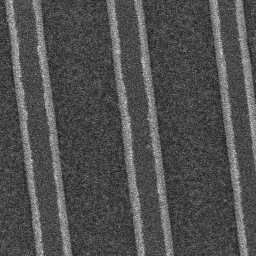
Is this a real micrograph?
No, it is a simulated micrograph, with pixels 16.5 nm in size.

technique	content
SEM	one or a few lines or trenches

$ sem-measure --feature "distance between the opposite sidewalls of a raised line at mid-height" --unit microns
0.484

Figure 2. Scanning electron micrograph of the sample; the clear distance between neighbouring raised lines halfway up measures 1190 nm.